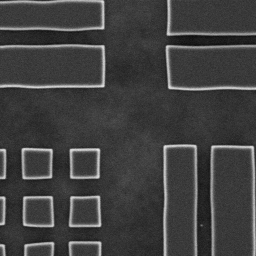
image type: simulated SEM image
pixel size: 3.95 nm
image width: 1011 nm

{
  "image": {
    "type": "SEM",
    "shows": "groups of lines, slits or small figures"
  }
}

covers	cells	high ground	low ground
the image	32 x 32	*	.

*************........***********
*************........***********
*************........***********
*************........***********
................................
................................
*************........***********
*************........***********
*************........***********
*************........***********
*************........***********
................................
................................
................................
................................
................................
................................
................................
.....................***...****.
*..***...***.........***..******
*..***...***.........****.******
*..***...***.........****.******
.....................****.******
.....................****.******
.....................****.******
*..****..***.........****.******
*..****..***.........***..******
*..****..***.........***...*****
.....................***...*****
.....................***...*****
.....*...***.........****..*****
*..****..***.........****..*****